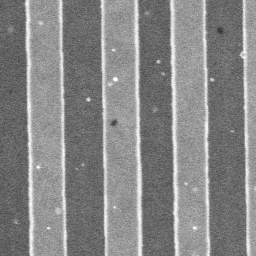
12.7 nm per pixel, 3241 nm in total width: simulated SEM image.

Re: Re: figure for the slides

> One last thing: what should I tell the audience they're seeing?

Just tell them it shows lines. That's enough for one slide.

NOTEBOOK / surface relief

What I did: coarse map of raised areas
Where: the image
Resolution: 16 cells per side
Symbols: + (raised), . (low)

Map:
..++..++...++..+
..++..++...++..+
..++..+++..++..+
..++..+++..++..+
..++..+++..++..+
..++..+++..++..+
..++..+++..++..+
..++..+++..++..+
..++..+++..++..+
..++..+++..++..+
..++..+++..++..+
..++...++..++..+
..++...++..++..+
..++...++..++..+
..++...++..++..+
..++...++..++..+